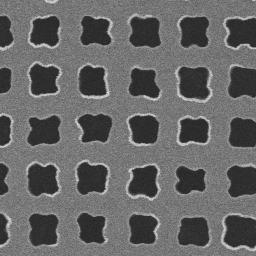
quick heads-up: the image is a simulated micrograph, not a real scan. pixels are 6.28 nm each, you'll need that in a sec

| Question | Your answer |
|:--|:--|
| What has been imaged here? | a regular array of holes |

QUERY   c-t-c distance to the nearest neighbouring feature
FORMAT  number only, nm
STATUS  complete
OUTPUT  305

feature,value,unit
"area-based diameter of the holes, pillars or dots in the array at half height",188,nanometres